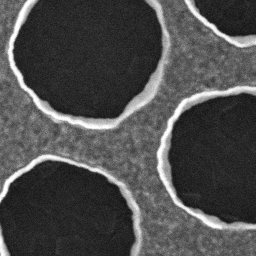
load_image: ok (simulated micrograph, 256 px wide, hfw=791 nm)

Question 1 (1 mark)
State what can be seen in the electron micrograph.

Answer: holes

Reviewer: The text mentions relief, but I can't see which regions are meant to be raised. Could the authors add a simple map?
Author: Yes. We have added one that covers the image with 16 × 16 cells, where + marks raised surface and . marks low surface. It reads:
++........++....
+.........+++...
+.........++++++
+.........++++++
+.........++++++
++.......+++++++
+++.....++++....
+++++..++++.....
+++++++++++.....
++++++++++......
++...+++++......
+......++++.....
........+++.....
........+++++...
.........+++++++
........++++++++